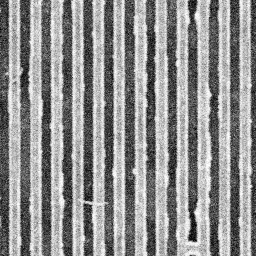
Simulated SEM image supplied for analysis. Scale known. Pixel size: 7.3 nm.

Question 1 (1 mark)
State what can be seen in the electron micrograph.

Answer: parallel lines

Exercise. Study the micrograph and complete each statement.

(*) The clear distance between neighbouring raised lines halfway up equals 0.0785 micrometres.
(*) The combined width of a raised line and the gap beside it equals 153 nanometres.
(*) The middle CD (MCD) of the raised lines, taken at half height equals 78.5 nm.